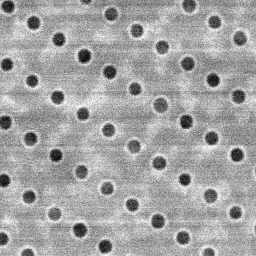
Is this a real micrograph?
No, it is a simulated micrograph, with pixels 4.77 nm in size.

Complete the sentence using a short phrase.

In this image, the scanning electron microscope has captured a regular array of holes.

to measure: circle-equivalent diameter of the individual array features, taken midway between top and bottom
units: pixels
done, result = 15.2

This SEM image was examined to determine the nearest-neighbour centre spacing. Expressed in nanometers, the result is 144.